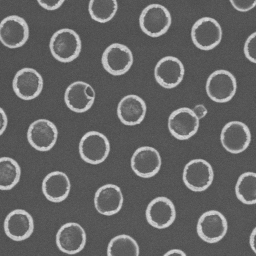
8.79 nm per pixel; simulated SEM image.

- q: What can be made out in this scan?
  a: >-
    a regular array of raised bodies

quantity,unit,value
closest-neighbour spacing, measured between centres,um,0.466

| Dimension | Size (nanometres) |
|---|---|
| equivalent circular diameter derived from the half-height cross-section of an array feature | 257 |